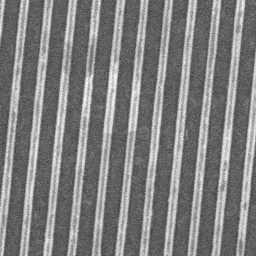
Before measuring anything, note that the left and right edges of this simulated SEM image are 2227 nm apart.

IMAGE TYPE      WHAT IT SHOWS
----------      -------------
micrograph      parallel lines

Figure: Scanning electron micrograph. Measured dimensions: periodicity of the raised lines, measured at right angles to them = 0.208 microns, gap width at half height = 0.156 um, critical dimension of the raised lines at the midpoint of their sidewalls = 49.8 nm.